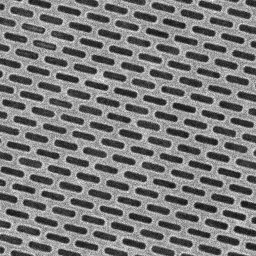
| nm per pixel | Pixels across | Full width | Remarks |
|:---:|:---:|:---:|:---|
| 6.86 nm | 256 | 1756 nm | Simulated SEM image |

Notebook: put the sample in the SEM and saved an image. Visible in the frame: a regular array of holes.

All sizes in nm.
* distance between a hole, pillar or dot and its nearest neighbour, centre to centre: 135